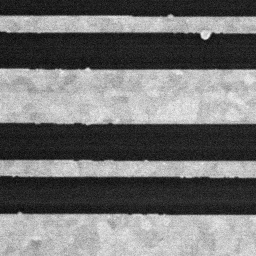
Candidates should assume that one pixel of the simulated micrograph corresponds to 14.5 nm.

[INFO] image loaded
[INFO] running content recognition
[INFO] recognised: lines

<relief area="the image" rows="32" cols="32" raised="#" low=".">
................................
................................
################################
################################
.........................#......
................................
................................
................................
................................
################################
################################
################################
################################
################################
################################
..........##....................
................................
................................
................................
................................
################################
################################
................................
................................
................................
................................
................................
################################
################################
################################
################################
################################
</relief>